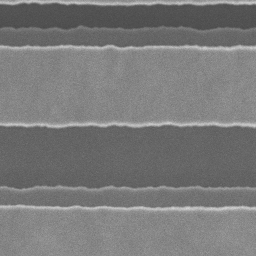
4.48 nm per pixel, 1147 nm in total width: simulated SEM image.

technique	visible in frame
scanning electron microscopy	lines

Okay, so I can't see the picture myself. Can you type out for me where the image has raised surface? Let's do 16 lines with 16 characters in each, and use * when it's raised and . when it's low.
................
................
................
****************
****************
****************
****************
****************
................
................
................
................
................
****************
****************
****************